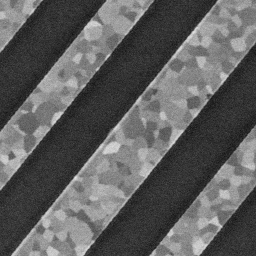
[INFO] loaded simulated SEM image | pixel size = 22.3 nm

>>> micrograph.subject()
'lines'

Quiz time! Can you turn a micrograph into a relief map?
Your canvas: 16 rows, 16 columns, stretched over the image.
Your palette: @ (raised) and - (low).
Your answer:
@@----@@@----@@@
@----@@@----@@@@
@----@@@----@@@@
----@@@----@@@@-
---@@@----@@@@--
--@@@----@@@@@--
-@@@----@@@@@---
-@@@----@@@@----
@@@----@@@@----@
@@----@@@@-----@
@----@@@@@----@@
----@@@@@----@@@
----@@@@----@@@-
---@@@@----@@@--
--@@@@-----@@@--
-@@@@@----@@@---